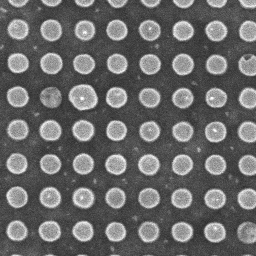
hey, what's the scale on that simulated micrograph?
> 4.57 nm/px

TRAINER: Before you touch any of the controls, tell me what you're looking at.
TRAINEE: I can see a regular array of raised bodies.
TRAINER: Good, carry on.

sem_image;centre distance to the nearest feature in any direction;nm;150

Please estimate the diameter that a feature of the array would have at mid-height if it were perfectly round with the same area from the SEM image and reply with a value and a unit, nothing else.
95.4 nanometers